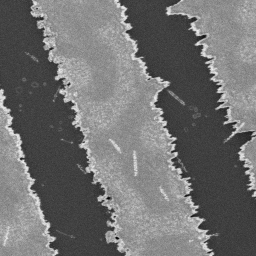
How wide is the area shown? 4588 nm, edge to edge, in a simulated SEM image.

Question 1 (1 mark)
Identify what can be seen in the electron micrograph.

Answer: one or a few lines or trenches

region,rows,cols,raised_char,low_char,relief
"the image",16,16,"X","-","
--XXXXXX---XXXXX
---XXXXX----XXXX
---XXXXX-----XXX
---XXXXXX----XXX
----XXXXX----XXX
----XXXXXX----XX
----XXXXXX----XX
X----XXXXX----XX
X----XXXXXX-----
X----XXXXXX----X
XX----XXXXX-----
XX----XXXXXX----
XX-----XXXXX----
XXX----XXXXX----
XXX----XXXXXX---
XXX-----XXXXX---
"